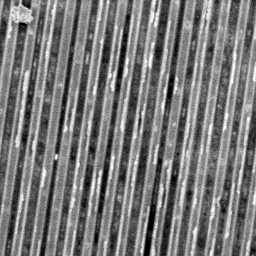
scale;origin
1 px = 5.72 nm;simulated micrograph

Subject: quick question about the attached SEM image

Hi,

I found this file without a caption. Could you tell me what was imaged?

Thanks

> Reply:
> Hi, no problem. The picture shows parallel lines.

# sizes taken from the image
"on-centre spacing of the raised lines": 17.3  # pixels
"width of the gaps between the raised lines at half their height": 50.9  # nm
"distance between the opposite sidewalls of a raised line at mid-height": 0.0452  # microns